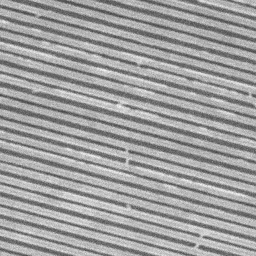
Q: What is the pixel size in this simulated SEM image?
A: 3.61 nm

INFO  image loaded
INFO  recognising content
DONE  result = parallel lines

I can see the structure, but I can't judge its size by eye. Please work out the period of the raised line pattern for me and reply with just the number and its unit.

38.5 nm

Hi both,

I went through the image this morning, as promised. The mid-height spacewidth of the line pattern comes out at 17.5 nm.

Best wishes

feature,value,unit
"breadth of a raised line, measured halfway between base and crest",5.79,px